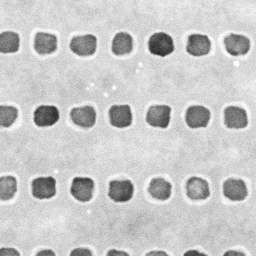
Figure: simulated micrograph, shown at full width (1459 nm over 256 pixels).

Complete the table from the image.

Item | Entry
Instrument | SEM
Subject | a regular array of holes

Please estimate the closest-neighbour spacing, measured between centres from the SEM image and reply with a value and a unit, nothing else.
215 nm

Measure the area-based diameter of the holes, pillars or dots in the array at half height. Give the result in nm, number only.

149